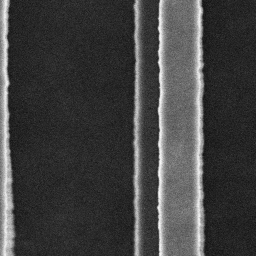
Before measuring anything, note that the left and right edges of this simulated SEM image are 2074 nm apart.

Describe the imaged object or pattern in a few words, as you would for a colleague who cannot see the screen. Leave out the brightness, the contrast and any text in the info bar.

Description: lines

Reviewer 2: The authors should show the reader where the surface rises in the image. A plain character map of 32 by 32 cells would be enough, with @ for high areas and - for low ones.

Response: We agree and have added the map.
@----------------@@@@@@@@-------
@----------------@@@@@@@@-------
@----------------@@@@@@@@-------
@----------------@@@@@@@@-------
@----------------@@@@@@@@-------
@----------------@@@@@@@@-------
@----------------@@@@@@@@-------
@----------------@@@@@@@@-------
@----------------@@@@@@@@-------
@----------------@@@@@@@@-------
@----------------@@@@@@@@-------
@----------------@@@@@@@@-------
@----------------@@@@@@@@-------
@----------------@@@@@@@@-------
@----------------@@@@@@@@-------
@----------------@@@@@@@@-------
@----------------@@@@@@@@-------
@----------------@@@@@@@@-------
@----------------@@@@@@@@-------
@----------------@@@@@@@@-------
@----------------@@@@@@@@-------
@----------------@@@@@@@@-------
@----------------@@@@@@@@-------
@----------------@@@@@@@@-------
@----------------@@@@@@@@-------
@----------------@@@@@@@@-------
@----------------@@@@@@@@-------
@----------------@@@@@@@@-------
@----------------@@@@@@@@-------
@----------------@@@@@@@@-------
@----------------@@@@@@@@-------
@----------------@@@@@@@@-------